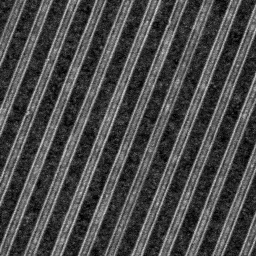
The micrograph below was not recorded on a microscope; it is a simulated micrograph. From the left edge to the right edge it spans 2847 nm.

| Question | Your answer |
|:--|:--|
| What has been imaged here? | parallel lines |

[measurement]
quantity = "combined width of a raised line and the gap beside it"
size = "279 nm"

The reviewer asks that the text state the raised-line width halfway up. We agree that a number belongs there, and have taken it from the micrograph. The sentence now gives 196 nm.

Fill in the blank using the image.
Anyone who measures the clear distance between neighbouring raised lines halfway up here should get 86.8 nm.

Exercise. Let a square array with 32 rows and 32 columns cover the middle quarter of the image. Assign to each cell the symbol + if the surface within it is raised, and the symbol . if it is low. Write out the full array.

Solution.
++..+++++..++++...++++..+++++..+
+...++++..+++++..+++++..++++..++
+..+++++..+++++..++++...++++..++
+..++++...++++..+++++..+++++..++
...++++..+++++..+++++..++++..+++
..+++++..++++...++++..+++++..+++
..++++..+++++..+++++..+++++..+++
.+++++..+++++..++++...++++..++++
.+++++..++++..+++++..+++++..++++
+++++..+++++..+++++..++++..+++++
+++++..+++++..++++..+++++..+++++
++++..+++++..+++++..++++...++++.
++++..+++++..+++++..++++..+++++.
++++..++++..+++++..+++++..+++++.
+++..+++++..+++++..++++..+++++..
+++..+++++..++++...++++..+++++..
++..+++++..+++++..+++++..++++..+
++..+++++..+++++..++++..+++++..+
++..++++...++++..+++++..+++++..+
+..+++++..+++++..++++...++++..++
+..+++++..++++...++++..+++++..++
...++++..+++++..+++++..++++...++
..+++++..+++++..++++..+++++..+++
..++++...++++..+++++..+++++..+++
.+++++..+++++..++++...++++..++++
.+++++..++++...++++..+++++..++++
.++++..+++++..+++++..++++...++++
+++++..+++++..+++++.+++++..+++++
+++++..++++..+++++..+++++..++++.
++++..+++++..++++...++++..+++++.
++++..+++++..++++..+++++..+++++.
+++..+++++..+++++..+++++..++++..